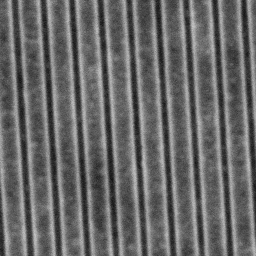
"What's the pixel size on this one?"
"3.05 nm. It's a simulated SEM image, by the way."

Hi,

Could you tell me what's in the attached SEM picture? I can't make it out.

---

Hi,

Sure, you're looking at parallel lines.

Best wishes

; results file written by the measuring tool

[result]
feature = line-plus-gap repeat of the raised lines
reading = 86.8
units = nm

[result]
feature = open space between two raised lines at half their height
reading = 20.9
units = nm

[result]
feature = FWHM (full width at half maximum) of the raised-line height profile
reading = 65.8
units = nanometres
